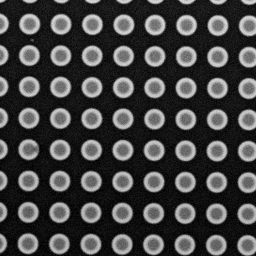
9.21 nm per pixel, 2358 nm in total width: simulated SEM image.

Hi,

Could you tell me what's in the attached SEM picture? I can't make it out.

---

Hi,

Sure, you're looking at an array of small figures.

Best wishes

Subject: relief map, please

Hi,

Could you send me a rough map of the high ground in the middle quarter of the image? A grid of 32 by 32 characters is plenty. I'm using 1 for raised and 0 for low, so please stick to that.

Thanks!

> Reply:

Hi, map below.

00000000000000000000001100000010
00000000000000000000000000000000
00000000000000000000000000000000
00000011000000110000000000000000
10000111100001111000011110000111
11000111100011111000111110001111
11000111100011111000111110001111
10000111100001111000011110001111
00000000000000000000000000000010
00000000000000000000000000000000
00000000000000000000000000000000
00000011000000110000001100000010
10000111100001111000011110001111
10001111100011111000111110001111
10000111100011111000111110001111
10000111100001111000011100000111
00000000000000000000000000000000
00000000000000000000000000000000
00000000000000000000000000000000
10000111000001110000011100000111
10000111100011111000111110001111
10001111100011111000111110001111
10000111100011111000111110001111
10000111000001110000011100000111
00000000000000000000000000000000
00000000000000000000000000000000
00000000000000000000000000000000
10000111100001110000011100000111
10001111100011111000111110001111
10001111100011111000111110001111
10000111100011111000111110001111
00000111000001110000011100000111